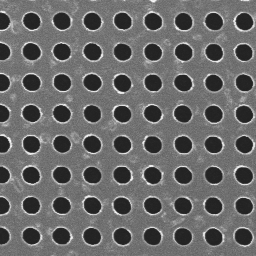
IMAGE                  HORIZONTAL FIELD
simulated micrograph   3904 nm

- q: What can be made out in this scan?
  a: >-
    a regular array of holes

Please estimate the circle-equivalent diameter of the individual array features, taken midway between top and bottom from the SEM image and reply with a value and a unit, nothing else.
260 nm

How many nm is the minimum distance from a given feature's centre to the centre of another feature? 459